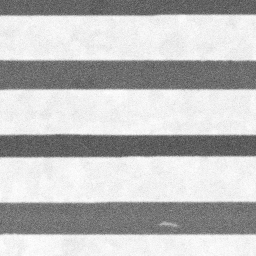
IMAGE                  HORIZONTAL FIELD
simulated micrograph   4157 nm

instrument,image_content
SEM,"lines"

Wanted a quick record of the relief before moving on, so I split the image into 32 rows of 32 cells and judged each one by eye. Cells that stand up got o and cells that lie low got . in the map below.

................................
................................
oooooooooooooooooooooooooooooooo
oooooooooooooooooooooooooooooooo
oooooooooooooooooooooooooooooooo
oooooooooooooooooooooooooooooooo
oooooooooooooooooooooooooooooooo
.........................o...ooo
................................
................................
................................
oooooooooooooooooooooooooooooooo
oooooooooooooooooooooooooooooooo
oooooooooooooooooooooooooooooooo
oooooooooooooooooooooooooooooooo
oooooooooooooooooooooooooooooooo
oooooooooooooooooooooooooooooooo
................................
................................
................................
oooooooooooooooooooooooooooooooo
oooooooooooooooooooooooooooooooo
oooooooooooooooooooooooooooooooo
oooooooooooooooooooooooooooooooo
oooooooooooooooooooooooooooooooo
................................
................................
................................
................................
oooooooooooooooooooooooooooooooo
oooooooooooooooooooooooooooooooo
oooooooooooooooooooooooooooooooo